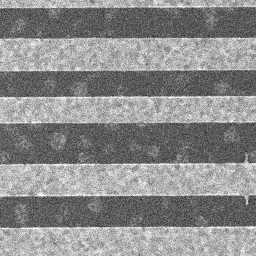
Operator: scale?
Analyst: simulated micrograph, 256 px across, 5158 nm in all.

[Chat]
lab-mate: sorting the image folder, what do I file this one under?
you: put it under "one or a few lines or trenches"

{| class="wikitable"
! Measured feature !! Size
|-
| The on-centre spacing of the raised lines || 1260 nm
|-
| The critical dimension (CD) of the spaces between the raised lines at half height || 31.8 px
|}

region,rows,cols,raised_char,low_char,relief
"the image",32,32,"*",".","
********************************
................................
................................
................................
................................
********************************
********************************
********************************
********************************
................................
................................
................................
********************************
********************************
********************************
................................
................................
................................
................................
................................
..............................**
********************************
********************************
********************************
*.............................*.
................................
................................
................................
...................*************
********************************
********************************
********************************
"